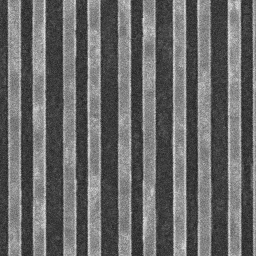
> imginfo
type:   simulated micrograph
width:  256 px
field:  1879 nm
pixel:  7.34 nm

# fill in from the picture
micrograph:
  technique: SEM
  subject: parallel lines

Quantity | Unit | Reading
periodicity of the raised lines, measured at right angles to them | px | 27.5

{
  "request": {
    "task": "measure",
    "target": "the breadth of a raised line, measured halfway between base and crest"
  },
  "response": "83.5 nm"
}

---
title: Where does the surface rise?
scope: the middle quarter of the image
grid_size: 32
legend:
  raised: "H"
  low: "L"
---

HHHLLLHHHLLLLLHHLLLLHHHLLLLLHHLL
HHHLLLHHHLLLLLHHLLLLHHHLLLLLHHLL
HHHLLLHHHLLLLLHHLLLLHHHLLLLLHHLL
HHHLLLHHHLLLLLHHLLLLHHHLLLLLHHLL
HHHLLLHHHLLLLLHHLLLLHHHLLLLLHHLL
HHHLLLHHHLLLLLHHLLLLHHHLLLLLHHLL
HHHLLLHHHLLLLLHHLLLLHHHLLLLLHHLL
HHHLLLHHHLLLLLHHLLLLHHHLLLLLHHLL
HHHLLLHHHLLLLLHHLLLLHHHLLLLLHHLL
HHHLLLHHHLLLLLHHLLLLHHHLLLLLHHLL
HHHLLLHHHLLLLLHHLLLLHHHLLLLLHHLL
HHHLLLHHHLLLLLHHLLLLHHHLLLLLHHLL
HHHLLLHHHLLLLLHHLLLLHHHLLLLLHHLL
HHHLLLHHHLLLLLHHLLLLHHHLLLLLHHLL
HHHLLLHHHLLLLLHHLLLLHHHLLLLLHHLL
HHHLLLHHHLLLLLHHLLLLHHHLLLLLHHLL
HHHLLLHHHLLLLLHHLLLLHHHLLLLLHHLL
HHHLLLHHHLLLLLHHLLLLHHHLLLLLHHLL
HHHLLLHHHLLLLLHHLLLLHHHLLLLLHHLL
HHHLLLHHHLLLLLHHLLLLHHHLLLLLHHLL
HHHLLLHHHLLLLLHHLLLLHHHLLLLLHHLL
HHHLLLHHHLLLLLHHLLLLHHHLLLLLHHLL
HHHLLLHHHLLLLLHHLLLLHHHLLLLLHHLL
HHHLLLHHHLLLLLHHLLLLHHHLLLLLHHLL
HHHLLLHHHLLLLLHHLLLLHHHLLLLLHHLL
HHHLLLHHHLLLLLHHLLLLHHHLLLLLHHLL
HHHLLLHHHLLLLLHHLLLLHHHLLLLLHHLL
HHHLLLHHHLLLLLHHLLLLHHHLLLLLHHLL
HHHLLLHHHLLLLLHHLLLLHHHLLLLLHHLL
HHHLLLHHHLLLLLHHLLLLHHHLLLLLHHLL
HHHLLLHHHLLLLLHHLLLLHHHLLLLLHHLL
HHHLLLHHHLLLLLHHLLLLHHHLLLLLHHLL